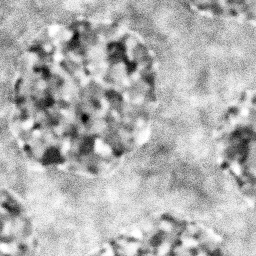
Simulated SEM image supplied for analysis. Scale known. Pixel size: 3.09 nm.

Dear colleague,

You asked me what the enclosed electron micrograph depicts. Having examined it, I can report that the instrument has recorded raised bodies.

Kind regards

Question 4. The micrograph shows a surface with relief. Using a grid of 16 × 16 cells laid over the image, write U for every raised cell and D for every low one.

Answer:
DDDDDDDDDDDDUUUU
DDDDUUUDDDDDDDDD
DDUUUUUUUDDDDDDD
DUUUUUUUUUDDDDDD
DUUUUUUUUUDDDDDD
DUUUUUUUUUDDDDDD
DUUUUUUUUUDDDDUU
DUUUUUUUUDDDDDUU
DUUUUUUUUDDDDUUU
DUUUUUUUDDDDDDUU
DDUDUUUDDDDDDDUU
DDDDDDDDDDDDDDDU
UDDDDDDDDDDDDDDU
UUDDDDDDDUUDDDDD
UUDDDDDDUUUUUDDD
UUDDDDUUUUUUUUDD